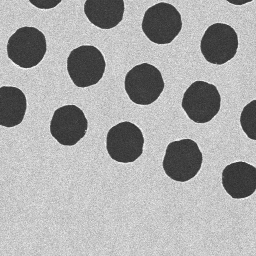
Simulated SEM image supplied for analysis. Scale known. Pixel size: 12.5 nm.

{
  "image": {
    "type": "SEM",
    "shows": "a regular array of holes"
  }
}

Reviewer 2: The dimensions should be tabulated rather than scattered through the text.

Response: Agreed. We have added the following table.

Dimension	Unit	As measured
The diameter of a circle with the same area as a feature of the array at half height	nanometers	500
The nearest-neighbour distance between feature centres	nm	751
